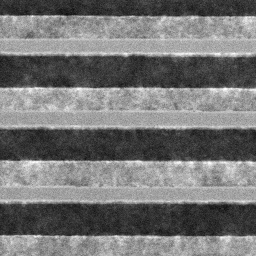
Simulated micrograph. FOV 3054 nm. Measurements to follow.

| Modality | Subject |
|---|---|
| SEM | lines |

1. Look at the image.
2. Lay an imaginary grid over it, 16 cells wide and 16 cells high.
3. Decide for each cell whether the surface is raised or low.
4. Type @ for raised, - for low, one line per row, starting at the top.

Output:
----------------
@@@@@@@@@@@@@@@@
@@@@@@@@@@@@@@@@
----------------
----------------
--@----@--------
@@@@@@@@@@@@@@@@
@@@@@@@@@@@@@@@@
----------------
----------------
@@@@@@@@@@@@@@@@
@@@@@@@@@@@@@@@@
@@@@@@@@@@@@@@@@
----------------
----------------
@@@@@@@@@@@@@@@@